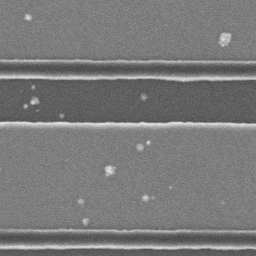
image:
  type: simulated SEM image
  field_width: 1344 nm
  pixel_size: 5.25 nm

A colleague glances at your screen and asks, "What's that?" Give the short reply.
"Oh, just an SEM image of lines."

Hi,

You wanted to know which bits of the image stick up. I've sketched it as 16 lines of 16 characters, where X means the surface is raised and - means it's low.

XXXXXXXXXXXXXXXX
XXXXXXXXXXXXXXXX
XXXXXXXXXXXXXXXX
XXXXXXXXXXXXXXXX
XXXXXXXXXXXXXXXX
----------------
----------------
----------------
XXXXXXXXXXXXXXXX
XXXXXXXXXXXXXXXX
XXXXXXXXXXXXXXXX
XXXXXXXXXXXXXXXX
XXXXXXXXXXXXXXXX
XXXXXXXXXXXXXXXX
XXXXXXXXXXXXXXXX
----------------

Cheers